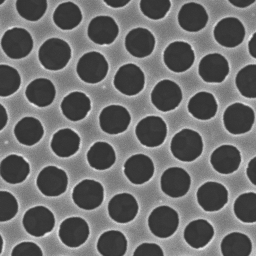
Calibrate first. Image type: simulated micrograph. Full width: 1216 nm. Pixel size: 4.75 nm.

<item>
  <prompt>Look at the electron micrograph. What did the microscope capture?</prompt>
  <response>a regular array of holes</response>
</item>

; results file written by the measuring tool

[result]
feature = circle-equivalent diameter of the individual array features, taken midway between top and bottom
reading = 146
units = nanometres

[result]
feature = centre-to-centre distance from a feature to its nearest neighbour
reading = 182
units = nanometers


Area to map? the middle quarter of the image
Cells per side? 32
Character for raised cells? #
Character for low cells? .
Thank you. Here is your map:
###........####...########......
###........##......########....#
###........##.......############
####......###.......############
#####....###........####....####
#############.......###......###
#############......###.......###
#....##########...####.......###
......################........##
.......###############.......##.
.......####...#########.....###.
......####......########...####.
......###.......################
#....####........###....########
#########........##......#######
#########.......##........######
..########.....###........###...
...#########.#####........##....
....##############.......##.....
....####..#########......##.....
....###.....########....###.....
...###.......##############.....
..####.......#####..#######.....
######.......###.....#######....
######.......##.......##########
#######.....###.......##########
#########.#####........##.....##
.##############.......###......#
.###############......##........
.###....#########...####........
.##.......##############........
##........##############.......#